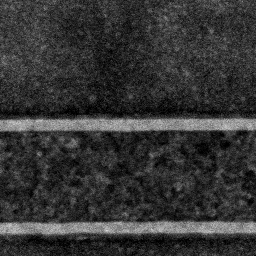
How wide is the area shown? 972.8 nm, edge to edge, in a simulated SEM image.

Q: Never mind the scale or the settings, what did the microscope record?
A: one or a few lines or trenches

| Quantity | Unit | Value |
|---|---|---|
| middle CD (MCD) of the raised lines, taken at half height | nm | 395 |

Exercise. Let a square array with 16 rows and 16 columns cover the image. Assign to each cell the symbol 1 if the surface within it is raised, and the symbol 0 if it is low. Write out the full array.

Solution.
0000000000000000
0000000000000000
0000000000000000
0000000000000000
0000000000000000
0000000000000000
0000000000000000
0000000000000000
1111111111111111
1111111111111111
1111111111111111
1111111111111111
1111111111111111
1111111111111111
0000000000000000
0000000000000000